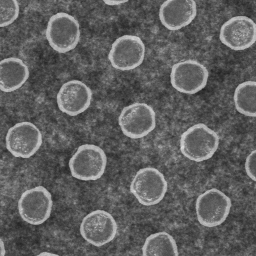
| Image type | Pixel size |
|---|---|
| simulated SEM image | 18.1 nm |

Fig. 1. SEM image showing a regular array of raised bodies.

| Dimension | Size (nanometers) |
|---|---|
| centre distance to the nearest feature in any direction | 1190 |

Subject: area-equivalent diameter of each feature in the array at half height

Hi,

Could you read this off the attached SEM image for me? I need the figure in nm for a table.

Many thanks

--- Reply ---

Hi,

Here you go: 602